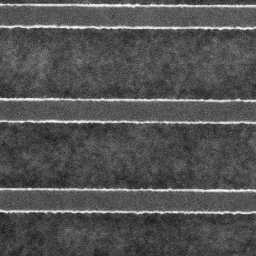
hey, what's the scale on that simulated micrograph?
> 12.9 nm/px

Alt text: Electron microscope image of lines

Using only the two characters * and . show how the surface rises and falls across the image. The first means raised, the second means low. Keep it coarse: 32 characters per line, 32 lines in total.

................................
********************************
********************************
...*.....**.********************
................................
................................
................................
................................
................................
................................
................................
................................
************************.**..*..
********************************
********************************
................................
................................
................................
................................
................................
................................
................................
................................
................................
********************************
********************************
***..***.***********************
................................
................................
................................
................................
................................